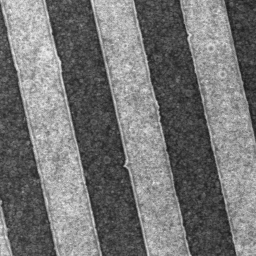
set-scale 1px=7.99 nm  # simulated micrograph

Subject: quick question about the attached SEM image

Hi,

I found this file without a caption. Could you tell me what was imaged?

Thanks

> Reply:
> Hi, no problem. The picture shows one or a few lines or trenches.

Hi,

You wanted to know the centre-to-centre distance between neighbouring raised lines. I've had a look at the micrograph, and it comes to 87.3 px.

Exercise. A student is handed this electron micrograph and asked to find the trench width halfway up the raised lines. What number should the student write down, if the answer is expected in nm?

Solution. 372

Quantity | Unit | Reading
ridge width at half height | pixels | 40.8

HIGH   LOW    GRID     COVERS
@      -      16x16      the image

@@@---@@---@@@--
@@@---@@@---@@--
-@@---@@@---@@@-
-@@@---@@---@@@-
-@@@---@@---@@@-
-@@@---@@----@@-
--@@---@@@---@@-
--@@---@@@---@@@
--@@@---@@---@@@
--@@@---@@---@@@
--@@@---@@@---@@
---@@---@@@---@@
---@@@---@@---@@
---@@@---@@---@@
---@@@---@@@---@
@---@@---@@@---@